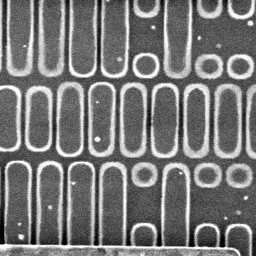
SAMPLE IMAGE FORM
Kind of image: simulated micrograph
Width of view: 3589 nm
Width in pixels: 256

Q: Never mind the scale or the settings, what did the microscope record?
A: wiring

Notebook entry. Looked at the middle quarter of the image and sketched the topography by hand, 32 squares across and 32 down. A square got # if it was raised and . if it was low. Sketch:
..######..######..#####...#####.
..######..#####...#####...#####.
...####...#####...#####...####..
................................
................................
###....#####....###.....###.....
####..######...#####...#####...#
####..######..######...#####..##
####..######..######..######..##
####..######..######..######..##
####..######..######..######..##
####..######..######..######..##
####..######..######..######..##
####...#####..######..######..##
####...#####..######..######..##
####..######..######..######..##
####..######..######..######..##
####..######..######..######..##
####..######..######..######..##
####..######..######..######..##
####..######..######..######..##
####...#####...#####..######...#
###.....##......###....####....#
................................
................................
..#####...####.....###.....##...
.######...#####...####....#####.
.######..######..######..######.
.######..######...#####..######.
.######..######...####...######.
.######..######..........######.
.######..######..........######.